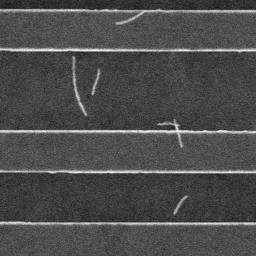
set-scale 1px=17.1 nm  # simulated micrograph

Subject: lines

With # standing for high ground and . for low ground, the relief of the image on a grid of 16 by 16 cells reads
................
################
################
................
................
................
................
................
################
################
################
................
................
................
################
################